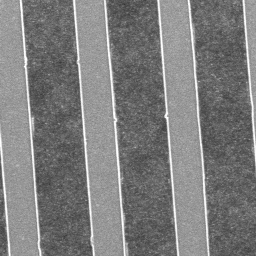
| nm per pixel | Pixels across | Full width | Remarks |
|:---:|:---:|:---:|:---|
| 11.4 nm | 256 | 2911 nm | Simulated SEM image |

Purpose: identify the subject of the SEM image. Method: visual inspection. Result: one or a few lines or trenches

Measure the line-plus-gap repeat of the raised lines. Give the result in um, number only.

0.957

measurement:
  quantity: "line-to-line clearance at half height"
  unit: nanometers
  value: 349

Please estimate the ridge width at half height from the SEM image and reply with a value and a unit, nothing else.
608 nanometers